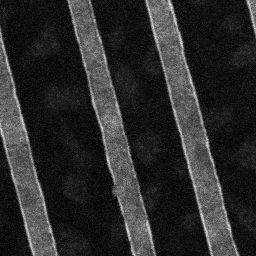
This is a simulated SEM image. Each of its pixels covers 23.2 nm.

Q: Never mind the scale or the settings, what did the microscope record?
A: one or a few lines or trenches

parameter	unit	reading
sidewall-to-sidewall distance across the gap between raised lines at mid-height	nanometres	1460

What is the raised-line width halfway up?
510 nm